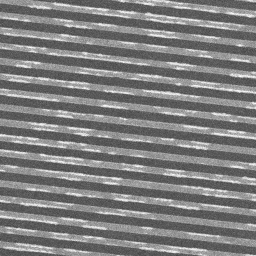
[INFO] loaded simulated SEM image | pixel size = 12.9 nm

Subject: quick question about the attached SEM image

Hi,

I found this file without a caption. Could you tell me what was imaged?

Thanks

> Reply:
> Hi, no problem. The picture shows parallel lines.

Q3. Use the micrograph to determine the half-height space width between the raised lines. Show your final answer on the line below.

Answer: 0.115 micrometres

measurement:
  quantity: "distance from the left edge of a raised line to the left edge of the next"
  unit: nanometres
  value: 196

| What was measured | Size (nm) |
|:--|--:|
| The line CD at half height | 80.1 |